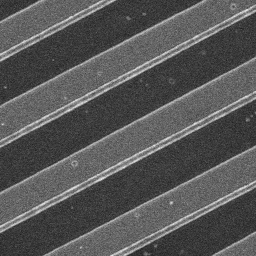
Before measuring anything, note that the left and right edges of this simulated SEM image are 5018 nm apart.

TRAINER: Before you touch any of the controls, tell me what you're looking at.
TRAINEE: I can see lines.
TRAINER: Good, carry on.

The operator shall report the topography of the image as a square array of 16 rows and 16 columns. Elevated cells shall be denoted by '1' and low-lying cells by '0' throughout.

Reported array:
0011110000001111
1111000000111100
1100000011111000
1000001111100000
0000111110000011
0011111000001111
1111100000011110
1110000001111000
1000000111100000
0000011111000001
0001111100000111
0111110000011111
1111000000111100
1100000011110000
0000001111100000
0000111110000011